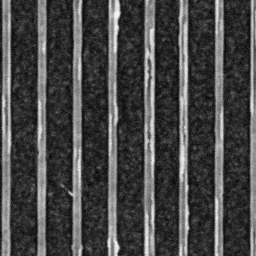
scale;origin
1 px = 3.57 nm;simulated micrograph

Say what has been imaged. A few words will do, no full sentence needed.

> parallel lines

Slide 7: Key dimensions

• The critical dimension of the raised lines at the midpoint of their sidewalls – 0.0285 micrometres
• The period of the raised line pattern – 126 nm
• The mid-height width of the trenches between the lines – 99.4 nm